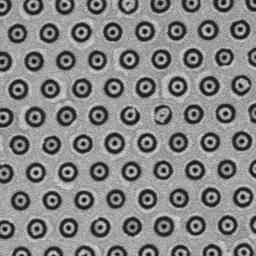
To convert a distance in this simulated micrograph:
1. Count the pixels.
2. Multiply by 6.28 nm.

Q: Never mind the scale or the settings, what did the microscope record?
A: a regular array of ring-shaped grooves with a dot in the middle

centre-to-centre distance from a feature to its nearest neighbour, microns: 0.198